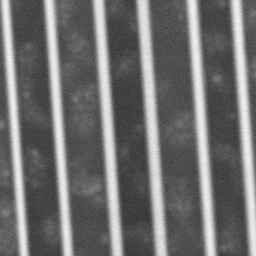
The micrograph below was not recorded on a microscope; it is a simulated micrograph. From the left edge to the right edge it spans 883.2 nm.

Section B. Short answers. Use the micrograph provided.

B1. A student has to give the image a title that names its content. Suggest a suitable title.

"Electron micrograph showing parallel lines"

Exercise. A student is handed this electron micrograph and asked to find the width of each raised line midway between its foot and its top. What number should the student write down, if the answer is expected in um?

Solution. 0.0292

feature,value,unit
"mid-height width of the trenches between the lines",125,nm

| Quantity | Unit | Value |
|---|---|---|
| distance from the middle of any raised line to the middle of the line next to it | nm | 159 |